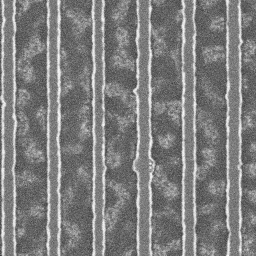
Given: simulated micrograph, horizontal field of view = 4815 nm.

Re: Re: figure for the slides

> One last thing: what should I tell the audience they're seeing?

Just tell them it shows parallel lines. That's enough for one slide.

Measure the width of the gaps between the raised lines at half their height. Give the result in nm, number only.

628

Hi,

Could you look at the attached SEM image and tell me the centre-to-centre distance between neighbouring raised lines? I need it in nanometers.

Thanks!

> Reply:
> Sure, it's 848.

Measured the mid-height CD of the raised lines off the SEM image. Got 233 nm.